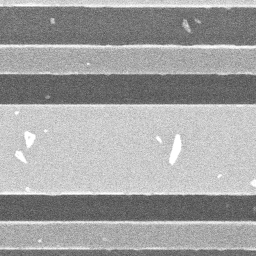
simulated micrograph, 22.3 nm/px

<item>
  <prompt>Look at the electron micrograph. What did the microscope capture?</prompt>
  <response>lines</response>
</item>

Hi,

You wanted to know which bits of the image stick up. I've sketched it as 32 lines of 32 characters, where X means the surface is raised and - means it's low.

XXXXXXXXXXXXXXXXXXXXXXXXXXXXXXXX
--------------------------------
--------------------------------
--------------------------------
--------------------------------
--------------------------------
XXXXXXXXXXXXXXXXXXXXXXXXXXXXXXXX
XXXXXXXXXXXXXXXXXXXXXXXXXXXXXXXX
XXXXXXXXXXXXXXXXXXXXXXXXXXXXXXXX
--------------------------------
--------------------------------
--------------------------------
--------------------------------
XXXXXXXXXXXXXXXXXXXXXXXXXXXXXXXX
XXXXXXXXXXXXXXXXXXXXXXXXXXXXXXXX
XXXXXXXXXXXXXXXXXXXXXXXXXXXXXXXX
XXXXXXXXXXXXXXXXXXXXXXXXXXXXXXXX
XXXXXXXXXXXXXXXXXXXXXXXXXXXXXXXX
XXXXXXXXXXXXXXXXXXXXXXXXXXXXXXXX
XXXXXXXXXXXXXXXXXXXXXXXXXXXXXXXX
XXXXXXXXXXXXXXXXXXXXXXXXXXXXXXXX
XXXXXXXXXXXXXXXXXXXXXXXXXXXXXXXX
XXXXXXXXXXXXXXXXXXXXXXXXXXXXXXXX
XXXXXXXXXXXXXXXXXXXXXXXXXXXXXXXX
--------------------------------
--------------------------------
--------------------------------
--------------------------------
XXXXXXXXXXXXXXXXXXXXXXXXXXXXXXXX
XXXXXXXXXXXXXXXXXXXXXXXXXXXXXXXX
XXXXXXXXXXXXXXXXXXXXXXXXXXXXXXXX
--------------------------------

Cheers